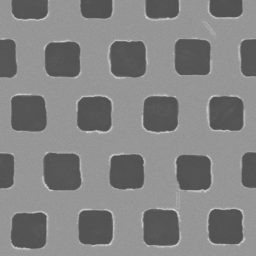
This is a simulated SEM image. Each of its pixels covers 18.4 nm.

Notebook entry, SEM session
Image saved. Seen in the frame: a regular array of holes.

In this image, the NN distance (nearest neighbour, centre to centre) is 1170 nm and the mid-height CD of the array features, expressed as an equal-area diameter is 703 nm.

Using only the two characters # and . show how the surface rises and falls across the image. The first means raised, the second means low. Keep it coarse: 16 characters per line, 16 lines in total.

#..##..##..##..#
################
.##########..###
.##..##..##..##.
.##..##..##..##.
################
#..##..##..##..#
#..##..##..##..#
################
################
.##..##..##..##.
.##..##..##..##.
################
#..##..##..##..#
#..##..##..##..#
################